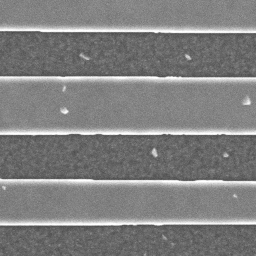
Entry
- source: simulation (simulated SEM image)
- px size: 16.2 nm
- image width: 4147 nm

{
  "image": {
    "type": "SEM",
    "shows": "lines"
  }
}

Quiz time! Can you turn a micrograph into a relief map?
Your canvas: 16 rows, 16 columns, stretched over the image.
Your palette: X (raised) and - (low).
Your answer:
XXXXXXXXXXXXXXXX
XXXXXXXXXXXXXXXX
----------------
----------------
----------------
XXXXXXXXXXXXXXXX
XXXXXXXXXXXXXXXX
XXXXXXXXXXXXXXXX
----------------
----------------
----------------
XXXXXXXXXXXXXXXX
XXXXXXXXXXXXXXXX
XXXXXXXXXXXXXXXX
----------------
----------------